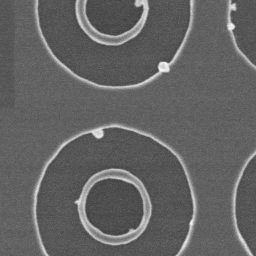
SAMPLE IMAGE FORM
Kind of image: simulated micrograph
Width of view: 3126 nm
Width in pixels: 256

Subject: ring-shaped grooves with a dot in the middle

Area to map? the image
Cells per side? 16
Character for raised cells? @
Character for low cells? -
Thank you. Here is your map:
@@----------@@--
@@---@------@@--
@@@---@@---@@@@-
@@@--------@@@@-
@@@@@-----@@@@@@
@@@@@@@@@@@@@@@@
@@@@@@@@@@@@@@@@
@@@@@@@@@@@@@@@@
@@@@@----@@@@@@@
@@@@-------@@@@@
@@@--------@@@@-
@@------@---@@@-
@@----------@@@-
@@----------@@@-
@@------@---@@@-
@@@--------@@@@-